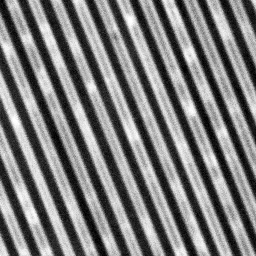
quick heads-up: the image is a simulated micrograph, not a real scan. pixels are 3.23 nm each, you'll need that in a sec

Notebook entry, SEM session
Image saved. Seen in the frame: parallel lines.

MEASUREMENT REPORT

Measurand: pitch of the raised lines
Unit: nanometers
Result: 66.9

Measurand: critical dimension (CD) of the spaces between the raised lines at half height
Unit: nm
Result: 36.2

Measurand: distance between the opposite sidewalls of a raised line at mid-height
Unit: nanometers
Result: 30.7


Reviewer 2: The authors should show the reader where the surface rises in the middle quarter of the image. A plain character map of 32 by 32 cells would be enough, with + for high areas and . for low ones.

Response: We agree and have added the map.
...+++...+++..+++...+++...++...+
+...++...+++...++....++...+++...
+...+++...++...+++...++....++...
+....++...+++...++...+++...+++..
++...++...+++...+++...++...+++..
++....++...+++...++...+++...+++.
+++...++...+++...++....++...+++.
.++...+++...++...+++...++....++.
.++....++...+++...++...+++...+++
..++...++....++...+++...++...+++
..++....++...++....++...+++...++
..+++...++...+++...++....++...++
...++...+++...++...+++...++....+
...++....++...+++...++...+++...+
....++...++....++...+++...++...+
+...++....++...++....++...+++...
+...+++...++...+++...++....++...
++...++...+++...++...+++...+++..
++...++....++...+++...++...+++..
++....++...++....++...+++...++..
+++...++....++...+++...++...+++.
.++...+++...++...+++...+++...++.
.+++...++...+++...+++..+++...+++
..++...++....++...+++...++...+++
..++....++...++....++...+++...++
..+++...++....++...+++...++...++
...++...+++...++...+++...+++...+
...+++...++...+++...+++..+++...+
....++...+++...++...+++...++...+
+...+++...++...+++...++...+++...
+...+++...++....++...+++...++...
++...++...+++...++...+++...+++..